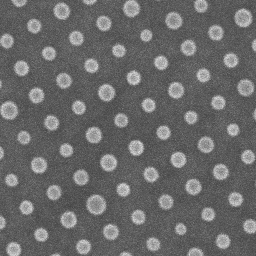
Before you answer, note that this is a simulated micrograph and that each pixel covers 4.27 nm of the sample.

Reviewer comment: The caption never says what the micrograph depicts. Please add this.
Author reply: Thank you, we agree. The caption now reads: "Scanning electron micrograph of a regular array of raised bodies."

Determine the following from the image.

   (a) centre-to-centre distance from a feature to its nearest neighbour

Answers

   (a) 0.132 um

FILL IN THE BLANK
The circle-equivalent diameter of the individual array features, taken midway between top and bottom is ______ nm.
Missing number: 55.9